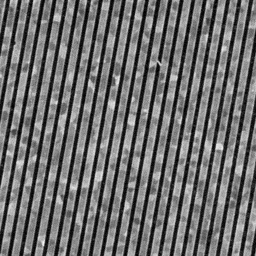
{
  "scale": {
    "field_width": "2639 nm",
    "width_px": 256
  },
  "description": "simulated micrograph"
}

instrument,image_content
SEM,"parallel lines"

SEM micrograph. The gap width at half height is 52.1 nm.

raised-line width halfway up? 66 nm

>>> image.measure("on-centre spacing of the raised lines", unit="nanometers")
118